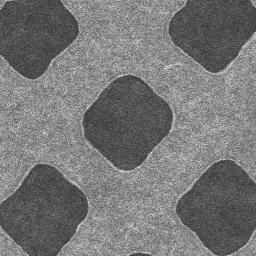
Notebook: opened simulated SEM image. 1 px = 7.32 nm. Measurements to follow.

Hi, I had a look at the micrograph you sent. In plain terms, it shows holes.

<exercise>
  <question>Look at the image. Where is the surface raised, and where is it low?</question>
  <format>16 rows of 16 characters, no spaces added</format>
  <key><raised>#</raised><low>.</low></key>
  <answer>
....#######.....
.....######.....
.....######.....
....########...#
#..##########.##
#######..#######
######....######
#####......#####
#####.....######
######...#######
##.####.#####..#
#....#######....
.....######.....
.....######.....
.....#######....
#...#########..#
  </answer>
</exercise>